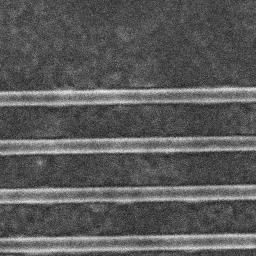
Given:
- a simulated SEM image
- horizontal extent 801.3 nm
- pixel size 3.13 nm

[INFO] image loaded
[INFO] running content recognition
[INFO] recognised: parallel lines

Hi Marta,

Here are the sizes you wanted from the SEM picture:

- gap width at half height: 112 nanometres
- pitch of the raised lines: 0.153 um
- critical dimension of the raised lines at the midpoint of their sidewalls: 0.0411 microns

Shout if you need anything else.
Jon